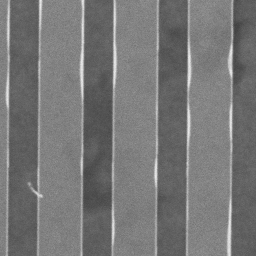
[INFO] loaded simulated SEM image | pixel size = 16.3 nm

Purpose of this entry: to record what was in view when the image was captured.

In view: groups of lines, slits or small figures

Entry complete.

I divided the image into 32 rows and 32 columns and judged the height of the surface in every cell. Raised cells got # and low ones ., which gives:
#....#####....######....#####...
#....#####....######....#####...
#....#####....######....#####...
#....#####....######....#####...
#....#####....######....#####...
#....#####....######....#####...
#....#####....######....#####...
#....#####....######....#####...
#....#####....######....#####...
#....#####....######....#####...
#....#####....######....#####...
#....#####....######....#####...
#....#####....######....#####...
#....#####....######....#####...
#....#####....######....#####...
#....#####....######....#####...
#....#####....######....#####...
#....#####....######....#####...
#....#####....######...######...
#....#####....######...######...
#....#####....#####....######...
#....#####....#####....######...
#....#####....#####....######...
#....#####....#####....######...
#....#####....#####....######...
#....#####....#####....######...
#....#####....#####....######...
#....#####....#####....######...
#....#####....#####....######...
#....#####....#####....######...
#....#####....#####....######...
#....#####....#####....######...